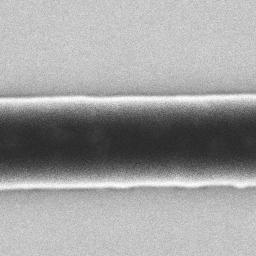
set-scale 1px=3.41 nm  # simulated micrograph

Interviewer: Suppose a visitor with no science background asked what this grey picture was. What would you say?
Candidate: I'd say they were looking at one or a few lines or trenches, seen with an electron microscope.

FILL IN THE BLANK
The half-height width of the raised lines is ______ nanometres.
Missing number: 302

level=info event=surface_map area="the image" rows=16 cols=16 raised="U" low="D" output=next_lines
DDDDDDDDDDDDDDDD
DDDDDDDDDDDDDDDD
DDDDDDDDDDDDDDDD
DDDDDDDDDDDDDDDD
DDDDDDDDDDDDDDDD
DDDDDDDDDDDDDDDD
UUUUUUUUUUUUUUUU
UUUUUUUUUUUUUUUU
UUUUUUUUUUUUUUUU
UUUUUUUUUUUUUUUU
UUUUUUUUUUUUUUUU
UUUUUUUUUUUUUUUU
DDDDDDDDDDDDDDDD
DDDDDDDDDDDDDDDD
DDDDDDDDDDDDDDDD
DDDDDDDDDDDDDDDD